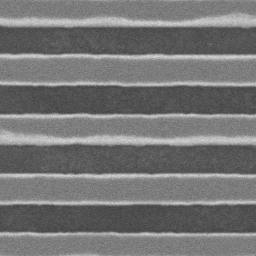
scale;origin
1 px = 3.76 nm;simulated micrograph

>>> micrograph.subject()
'lines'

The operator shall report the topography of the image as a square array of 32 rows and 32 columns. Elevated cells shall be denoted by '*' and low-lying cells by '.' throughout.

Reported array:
********************************
********************************
********************************
................................
................................
................................
................................
********************************
********************************
********************************
********************************
................................
................................
................................
********************************
********************************
********************************
********************************
................................
................................
................................
................................
********************************
********************************
********************************
.......................*........
................................
................................
................................
********************************
********************************
********************************